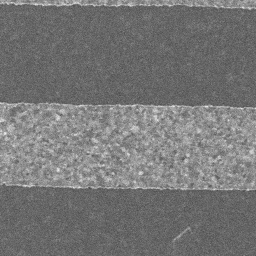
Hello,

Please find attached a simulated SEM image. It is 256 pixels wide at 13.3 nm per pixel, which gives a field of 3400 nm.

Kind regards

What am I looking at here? one or a few lines or trenches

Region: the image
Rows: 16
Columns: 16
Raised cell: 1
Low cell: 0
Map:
0000000000000001
0000000000000000
0000000000000000
0000000000000000
0000000000000000
0000000000000000
1110000000000000
1111111111111111
1111111111111111
1111111111111111
1111111111111111
1111111111111111
0000000000000000
0000000000000000
0000000000000000
0000000000010000